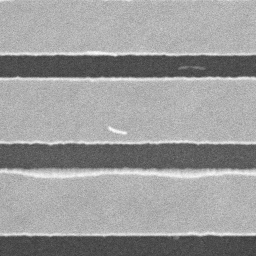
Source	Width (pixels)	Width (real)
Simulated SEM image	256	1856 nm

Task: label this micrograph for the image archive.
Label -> lines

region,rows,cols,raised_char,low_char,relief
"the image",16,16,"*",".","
****************
****************
****************
................
................
****************
****************
****************
****************
................
................
****************
****************
****************
****************
................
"